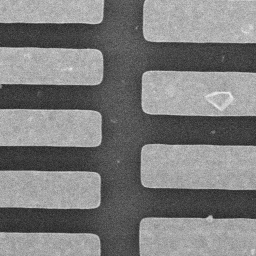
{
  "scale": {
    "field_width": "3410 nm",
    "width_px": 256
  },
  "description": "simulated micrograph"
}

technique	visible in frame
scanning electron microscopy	groups of lines, slits or small figures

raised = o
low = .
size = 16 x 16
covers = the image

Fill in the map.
oooooo...ooooooo
.........ooooooo
.........ooooooo
oooooo..........
oooooo...ooo....
.........ooooooo
.........ooooooo
oooooo..........
oooooo..........
.........ooooooo
.........ooooooo
oooooo...ooooooo
oooooo..........
................
.........ooooooo
oooooo...ooooooo